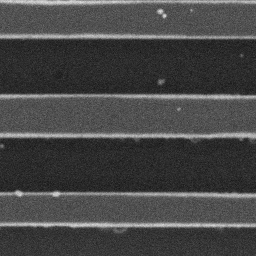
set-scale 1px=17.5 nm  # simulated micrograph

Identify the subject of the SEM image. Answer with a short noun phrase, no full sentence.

lines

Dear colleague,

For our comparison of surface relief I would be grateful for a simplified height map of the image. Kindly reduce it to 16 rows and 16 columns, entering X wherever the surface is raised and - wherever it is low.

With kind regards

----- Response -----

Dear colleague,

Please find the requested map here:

XXXXXXXXXXXXXXXX
XXXXXXXXXXXXXXXX
----------------
----------------
----------------
----------------
XXXXXXXXXXXXXXXX
XXXXXXXXXXXXXXXX
XXXXXXXXXXXXXXXX
----------------
----------------
----------------
XXXXXXXXXXXXXXXX
XXXXXXXXXXXXXXXX
----------------
----------------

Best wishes